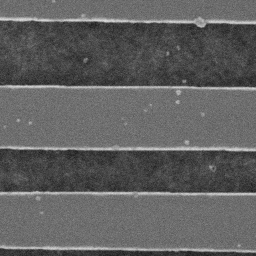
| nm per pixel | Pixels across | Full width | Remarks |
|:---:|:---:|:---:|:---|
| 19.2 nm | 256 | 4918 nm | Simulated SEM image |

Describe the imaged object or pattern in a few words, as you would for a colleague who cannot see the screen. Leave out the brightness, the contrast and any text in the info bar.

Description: lines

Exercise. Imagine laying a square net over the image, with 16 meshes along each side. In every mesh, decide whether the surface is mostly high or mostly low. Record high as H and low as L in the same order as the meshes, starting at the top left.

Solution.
HHHHHHHHHHHHHHHH
LLLLLLLLLLLLHLLL
LLLLLLLLLLLLLLLL
LLLLLLLLLLLLLLLL
LLLLLLLLLLLLLLLL
HHHHHHHHHHHHHHHH
HHHHHHHHHHHHHHHH
HHHHHHHHHHHHHHHH
HHHHHHHHHHHHHHHH
LLLLLLLLLLLLLLLL
LLLLLLLLLLLLLLLL
LLLLLLLLLLLLLLLL
HHHHHHHHHHHHHHHH
HHHHHHHHHHHHHHHH
HHHHHHHHHHHHHHHH
HHHHHHHHHHHHHHHH